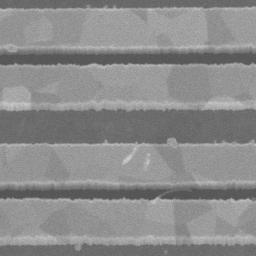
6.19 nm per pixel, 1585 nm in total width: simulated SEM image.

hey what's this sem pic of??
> lines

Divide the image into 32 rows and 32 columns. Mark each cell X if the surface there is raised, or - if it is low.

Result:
--------------------------------
XXXXXXXXXXXXXXXXXXXXXXXXXXXXXXXX
XXXXXXXXXXXXXXXXXXXXXXXXXXXXXXXX
XXXXXXXXXXXXXXXXXXXXXXXXXXXXXXXX
XXXXXXXXXXXXXXXXXXXXXXXXXXXXXXXX
XXXXXXXXXXXXXXXXXXXXXXXXXXXXXXXX
--------------------------------
--------------------------------
XXXXXXXXXXXXXXXXXXXXXXXXXXXXXXXX
XXXXXXXXXXXXXXXXXXXXXXXXXXXXXXXX
XXXXXXXXXXXXXXXXXXXXXXXXXXXXXXXX
XXXXXXXXXXXXXXXXXXXXXXXXXXXXXXXX
XXXXXXXXXXXXXXXXXXXXXXXXXXXXXXXX
--------------------------------
--------------------------------
--------------------------------
--------------------------------
---------------------X----------
XXXXXXXXXXXXXXXXXXXXXXXXXXXXXXXX
XXXXXXXXXXXXXXXXXXXXXXXXXXXXXXXX
XXXXXXXXXXXXXXXXXXXXXXXXXXXXXXXX
XXXXXXXXXXXXXXXXXXXXXXXXXXXXXXXX
XXXXXXXXXXXXXXXXXXXXXXXXXXXXXXXX
--------------------------------
--------------------------------
XXXXXXXXXXXXXXXXXXXXXXXXXXXXXXXX
XXXXXXXXXXXXXXXXXXXXXXXXXXXXXXXX
XXXXXXXXXXXXXXXXXXXXXXXXXXXXXXXX
XXXXXXXXXXXXXXXXXXXXXXXXXXXXXXXX
XXXXXXXXXXXXXXXXXXXXXXXXXXXXXXXX
--------------------------------
--------------------------------